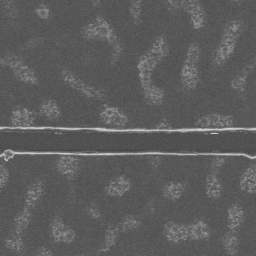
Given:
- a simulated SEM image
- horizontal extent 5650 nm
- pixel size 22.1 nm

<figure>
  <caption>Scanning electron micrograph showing one or a few lines or trenches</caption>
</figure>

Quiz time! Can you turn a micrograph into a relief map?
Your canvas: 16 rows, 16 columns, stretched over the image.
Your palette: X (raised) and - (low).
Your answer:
XXXXXXXXXXXXXXXX
XXXXXXXXXXXXXXXX
XXXXXXXXXXXXXXXX
XXXXXXXXXXXXXXXX
XXXXXXXXXXXXXXXX
XXXXXXXXXXXXXXXX
XXXXXXXXXXXXXXXX
XXXXXXXXXXXXXXXX
----------------
----------------
XXXXXXXXXXXXXXXX
XXXXXXXXXXXXXXXX
XXXXXXXXXXXXXXXX
XXXXXXXXXXXXXXXX
XXXXXXXXXXXXXXXX
XXXXXXXXXXXXXXXX